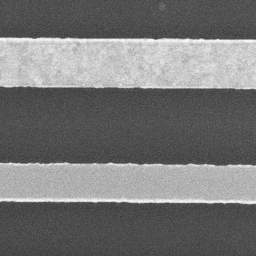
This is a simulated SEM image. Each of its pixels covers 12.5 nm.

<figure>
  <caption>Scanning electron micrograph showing lines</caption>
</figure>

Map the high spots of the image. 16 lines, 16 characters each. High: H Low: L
LLLLLLLLLLLLLLLL
LLLLLLLLLLLLLLLL
HHHHHHHHHHHLLLLL
HHHHHHHHHHHHHHHH
HHHHHHHHHHHHHHHH
LLLLLLLLLLLLLLHH
LLLLLLLLLLLLLLLL
LLLLLLLLLLLLLLLL
LLLLLLLLLLLLLLLL
LLLLLLLLLLLLLLLL
HHHHHHHHHHHHHHHH
HHHHHHHHHHHHHHHH
HHHHHHHHHHHHHHHH
LLLLLLLLLLLLLLLL
LLLLLLLLLLLLLLLL
LLLLLLLLLLLLLLLL